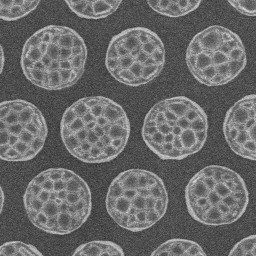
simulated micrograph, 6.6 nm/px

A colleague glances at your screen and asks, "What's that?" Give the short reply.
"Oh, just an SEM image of a regular array of raised bodies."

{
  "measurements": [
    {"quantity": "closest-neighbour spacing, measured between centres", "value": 527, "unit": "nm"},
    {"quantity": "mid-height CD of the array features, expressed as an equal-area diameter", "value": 406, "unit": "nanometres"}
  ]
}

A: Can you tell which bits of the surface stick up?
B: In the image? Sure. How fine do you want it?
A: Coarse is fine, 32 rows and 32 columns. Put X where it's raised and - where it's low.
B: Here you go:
XXXXX---XXXXXXX----XXXXXX----XXX
XXXX-----XXXXX------XXXX------XX
--------------------------------
------XX------------------XX----
----XXXXXX-----XXXX-----XXXXXX--
---XXXXXXXX---XXXXXX----XXXXXX--
---XXXXXXXX--XXXXXXXX--XXXXXXXX-
---XXXXXXXX--XXXXXXX---XXXXXXXX-
---XXXXXXX---XXXXXXX----XXXXXX--
---XXXXXXX----XXXXX-----XXXXX---
----XXXXX-------XX--------XX----
--------------------------------
----------XXXX-------XXX------XX
XXXXX----XXXXXX----XXXXXX----XXX
XXXXX---XXXXXXXX--XXXXXXX---XXXX
XXXXXX--XXXXXXXX--XXXXXXXX--XXXX
XXXXXX--XXXXXXXX--XXXXXXXX--XXXX
XXXXXX--XXXXXXXX--XXXXXXXX--XXXX
XXXXX---XXXXXXX----XXXXXX----XXX
XXXX-----XXXXX------XXX--------X
--------------------------------
-----XXXX-------XXX------XXXX---
----XXXXXX----XXXXXX----XXXXXX--
---XXXXXXXX---XXXXXXX--XXXXXXXX-
---XXXXXXXX--XXXXXXXX--XXXXXXXX-
---XXXXXXXX--XXXXXXXX---XXXXXXX-
---XXXXXXXX---XXXXXX----XXXXXX--
----XXXXXXX---XXXXXX-----XXXX---
-----XXXXX------XX--------------
-------------------------------X
-XX--------XXX------XXXX------XX
XXXXX-----XXXXX----XXXXXX----XXX